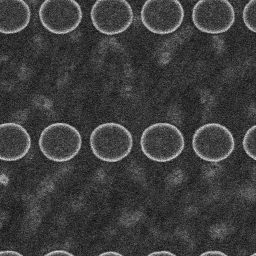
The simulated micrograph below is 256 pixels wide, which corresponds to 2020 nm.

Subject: raised bodies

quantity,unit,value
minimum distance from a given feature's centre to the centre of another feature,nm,403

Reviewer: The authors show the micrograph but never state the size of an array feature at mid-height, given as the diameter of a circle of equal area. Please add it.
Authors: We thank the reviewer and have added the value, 309 nm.